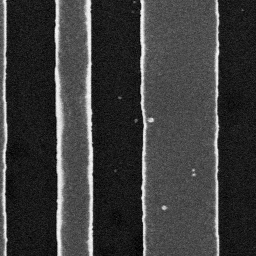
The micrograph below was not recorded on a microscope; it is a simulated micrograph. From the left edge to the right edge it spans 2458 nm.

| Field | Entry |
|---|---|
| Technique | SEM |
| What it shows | lines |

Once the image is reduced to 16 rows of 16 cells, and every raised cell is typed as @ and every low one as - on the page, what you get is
----@@---@@@@@--
---@@@---@@@@@--
---@@@---@@@@@--
----@@---@@@@@--
---@@@---@@@@@--
----@@---@@@@@--
----@@---@@@@@--
----@@---@@@@@--
----@@---@@@@@--
----@@---@@@@@--
----@@---@@@@@--
----@@---@@@@@--
----@@---@@@@@--
----@@---@@@@@--
----@@---@@@@@--
----@@---@@@@@--